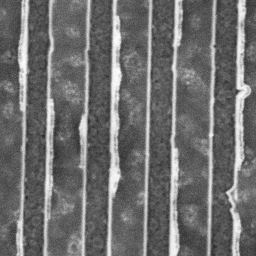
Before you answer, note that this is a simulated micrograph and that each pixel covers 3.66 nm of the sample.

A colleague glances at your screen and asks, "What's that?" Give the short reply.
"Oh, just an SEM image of one or a few lines or trenches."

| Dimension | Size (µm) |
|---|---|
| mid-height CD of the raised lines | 0.139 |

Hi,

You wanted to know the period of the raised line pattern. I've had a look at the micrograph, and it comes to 0.23 micrometres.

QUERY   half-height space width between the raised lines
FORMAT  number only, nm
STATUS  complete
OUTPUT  89.7